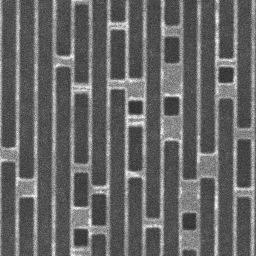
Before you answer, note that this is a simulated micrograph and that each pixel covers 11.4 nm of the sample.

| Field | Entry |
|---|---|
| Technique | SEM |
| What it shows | parallel lines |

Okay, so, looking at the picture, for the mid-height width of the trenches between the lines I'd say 0.166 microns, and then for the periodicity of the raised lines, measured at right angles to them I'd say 207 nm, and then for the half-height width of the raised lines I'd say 44.4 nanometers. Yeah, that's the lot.